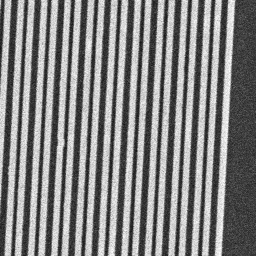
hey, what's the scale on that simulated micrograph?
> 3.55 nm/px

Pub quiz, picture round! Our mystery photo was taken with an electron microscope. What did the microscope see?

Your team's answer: parallel lines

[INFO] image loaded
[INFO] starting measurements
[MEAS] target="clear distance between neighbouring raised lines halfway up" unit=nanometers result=23.5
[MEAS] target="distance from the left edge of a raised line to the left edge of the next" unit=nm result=41.6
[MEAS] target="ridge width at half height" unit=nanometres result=20.4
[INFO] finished